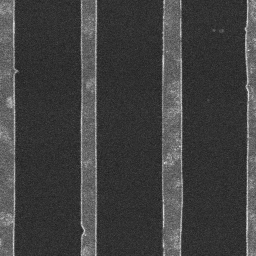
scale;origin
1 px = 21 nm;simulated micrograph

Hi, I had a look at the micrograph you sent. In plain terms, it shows one or a few lines or trenches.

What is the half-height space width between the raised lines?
1400 nanometres